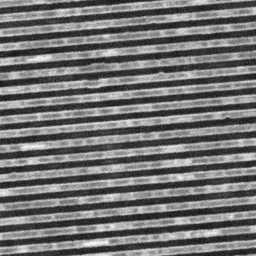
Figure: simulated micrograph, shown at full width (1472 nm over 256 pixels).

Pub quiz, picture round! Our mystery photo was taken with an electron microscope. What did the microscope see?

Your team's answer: parallel lines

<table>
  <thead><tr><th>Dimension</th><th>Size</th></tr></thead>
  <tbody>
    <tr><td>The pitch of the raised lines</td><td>83.3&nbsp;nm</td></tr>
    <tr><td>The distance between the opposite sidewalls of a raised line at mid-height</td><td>36.5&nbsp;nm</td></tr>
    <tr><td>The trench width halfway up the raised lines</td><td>45.8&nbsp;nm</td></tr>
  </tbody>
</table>